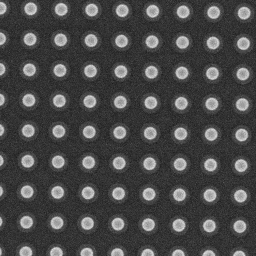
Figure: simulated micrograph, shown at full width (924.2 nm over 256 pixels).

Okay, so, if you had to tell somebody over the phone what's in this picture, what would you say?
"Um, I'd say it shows an array of small figures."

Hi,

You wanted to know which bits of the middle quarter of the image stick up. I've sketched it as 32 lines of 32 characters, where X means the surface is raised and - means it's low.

X----XXXX---XXXX----XXXX----XXX-
X---XXXXX---XXXXX--XXXXX---XXXXX
X---XXXXX---XXXXX--XXXXX---XXXXX
X----XXXX---XXXX----XXXX---XXXXX
-----------------------------X--
--------------------------------
--------------------------------
X----XXX-----XXX----XXX-----X---
X---XXXXX---XXXX---XXXXX---XXXX-
X---XXXXX---XXXX---XXXXX---XXXXX
X---XXXXX---XXXX---XXXXX---XXXXX
-----XXX-----XXX----XXX----XXXX-
--------------------------------
--------------------------------
--------------------------------
X---XXXX----XXXX----XXX-----XXX-
X---XXXXX--XXXXX---XXXXX---XXXX-
X---XXXXX--XXXXX---XXXXX---XXXXX
X---XXXX----XXXX---XXXXX---XXXX-
-------------XX-----XXX-----XXX-
--------------------------------
--------------------------------
-----XX------XX-----------------
X---XXXX----XXXX---XXXX----XXXX-
X---XXXXX--XXXXX---XXXXX---XXXX-
X---XXXX---XXXXX---XXXXX---XXXX-
----XXXX----XXXX---XXXX----XXXX-
--------------------------------
--------------------------------
--------------------------------
----XXXX----XXX-----XXX-----XX--
X---XXXX---XXXXX---XXXXX---XXXX-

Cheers